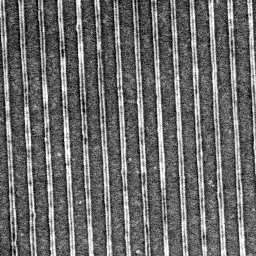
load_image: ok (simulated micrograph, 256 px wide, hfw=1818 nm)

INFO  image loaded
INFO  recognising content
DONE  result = parallel lines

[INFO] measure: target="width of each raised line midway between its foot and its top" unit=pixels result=3.49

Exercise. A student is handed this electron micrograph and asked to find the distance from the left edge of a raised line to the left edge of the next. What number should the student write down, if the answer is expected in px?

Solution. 19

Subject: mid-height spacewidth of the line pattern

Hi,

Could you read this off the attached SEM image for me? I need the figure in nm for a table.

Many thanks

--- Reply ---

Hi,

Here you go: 108